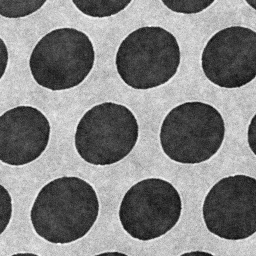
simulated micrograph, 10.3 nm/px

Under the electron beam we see holes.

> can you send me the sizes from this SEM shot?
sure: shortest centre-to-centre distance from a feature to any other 0.885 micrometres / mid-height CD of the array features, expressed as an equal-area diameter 663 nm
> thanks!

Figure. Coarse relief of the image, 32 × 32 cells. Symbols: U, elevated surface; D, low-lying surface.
DDDDDDUUUDDDDDDDUUUUDDDDDDUUUUUD
DDDDUUUUUUDDDDDUUUUUUUDDDUUUUUUU
UUUUUUUUUUUUUUUUUUUUUUUUUUUUUUUU
UUUUUUUUDUUUUUUUUUDDUUUUUUUUDDDU
UUUUUUDDDDDUUUUUDDDDDDUUUUUDDDDD
DUUUUDDDDDDDUUUDDDDDDDUUUUDDDDDD
DUUUDDDDDDDDUUUDDDDDDDDUUDDDDDDD
DUUUDDDDDDDDUUDDDDDDDDDUUDDDDDDD
DUUUDDDDDDDDUUUDDDDDDDUUUDDDDDDD
UUUUDDDDDDDUUUUDDDDDDDUUUUDDDDDD
UUUUUDDDDDUUUUUUDDDDUUUUUUUDDDDU
UUUUUUUUUUUUUUUUUUUUUUUUUUUUUUUU
UUUUUUUUUUUUUUUUUUUUUUUUUUUUUUUU
UUDDUUUUUUUDDDDDUUUUUUDDDDDUUUUU
DDDDDDUUUUDDDDDDDUUUUDDDDDDDUUUU
DDDDDDUUUUDDDDDDDUUUDDDDDDDDUUUD
DDDDDDUUUDDDDDDDDUUUDDDDDDDDUUUD
DDDDDDUUUDDDDDDDDUUUDDDDDDDDUUUD
DDDDDDUUUDDDDDDDDUUUDDDDDDDUUUUD
DDDDDUUUUUDDDDDDUUUUUDDDDDDUUUUU
UDDUUUUUUUUDDDUUUUUUUUUUUUUUUUUU
UUUUUUUUUUUUUUUUUUUUUUUUUUUUUUUU
UUUUUUUDDDDUUUUUUUDDDUUUUUUDDDDD
DUUUUDDDDDDDUUUUDDDDDDUUUUDDDDDD
DUUUUDDDDDDDUUUDDDDDDDUUUUDDDDDD
DDUUDDDDDDDDUUUDDDDDDDDUUDDDDDDD
DDUUDDDDDDDDUUUDDDDDDDDUUDDDDDDD
DUUUDDDDDDDDUUUDDDDDDDUUUDDDDDDD
DUUUDDDDDDDUUUUDDDDDDDUUUUDDDDDD
UUUUUDDDDDUUUUUUDDDDUUUUUUUDDDDU
UUUUUUUUUUUUUUUUUUUUUUUUUUUUUUUU
UUUUUUUUUUUUUDUUUUUUUUUUDDUUUUUU